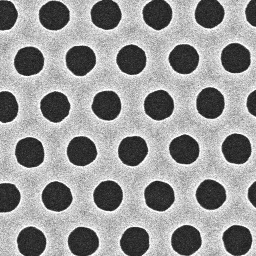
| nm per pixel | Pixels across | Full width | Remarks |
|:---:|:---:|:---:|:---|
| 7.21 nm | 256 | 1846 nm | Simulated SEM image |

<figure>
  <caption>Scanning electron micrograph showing a regular array of holes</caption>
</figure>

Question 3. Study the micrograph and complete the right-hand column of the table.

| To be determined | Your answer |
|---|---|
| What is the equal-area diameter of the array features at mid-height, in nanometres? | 221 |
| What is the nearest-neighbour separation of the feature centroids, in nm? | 371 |